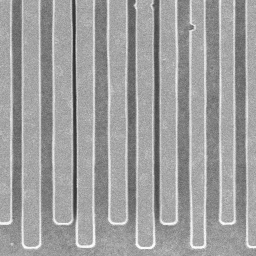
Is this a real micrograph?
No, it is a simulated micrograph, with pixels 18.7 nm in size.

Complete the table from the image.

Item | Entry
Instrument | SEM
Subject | parallel lines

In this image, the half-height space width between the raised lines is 0.22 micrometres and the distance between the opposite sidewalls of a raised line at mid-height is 330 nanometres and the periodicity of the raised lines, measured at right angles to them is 524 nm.